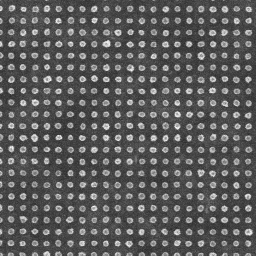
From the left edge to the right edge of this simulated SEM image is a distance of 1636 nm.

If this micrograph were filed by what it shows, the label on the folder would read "a regular array of raised bodies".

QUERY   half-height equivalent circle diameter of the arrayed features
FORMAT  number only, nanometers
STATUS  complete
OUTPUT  36.8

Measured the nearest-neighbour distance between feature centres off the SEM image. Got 0.072 µm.